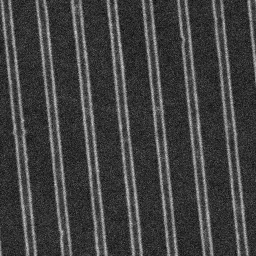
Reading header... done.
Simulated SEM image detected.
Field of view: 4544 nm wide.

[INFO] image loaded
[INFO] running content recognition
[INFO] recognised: parallel lines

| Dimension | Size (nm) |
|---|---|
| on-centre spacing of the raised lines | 623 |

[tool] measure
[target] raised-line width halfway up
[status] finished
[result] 0.148 µm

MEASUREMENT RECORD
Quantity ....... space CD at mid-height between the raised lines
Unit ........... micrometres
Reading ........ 0.479